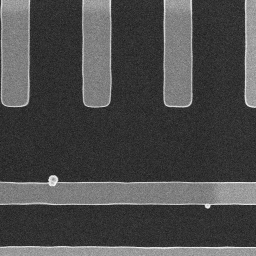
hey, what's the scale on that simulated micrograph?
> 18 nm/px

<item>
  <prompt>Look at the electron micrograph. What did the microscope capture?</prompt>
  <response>groups of lines, slits or small figures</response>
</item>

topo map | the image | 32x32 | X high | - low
XXXX------XXXX-------XXX-------X
XXXX------XXXX-------XXX-------X
XXXX------XXXX-------XXX-------X
XXXX------XXXX-------XXX-------X
XXXX------XXXX-------XXX-------X
XXXX------XXXX-------XXX-------X
XXXX------XXXX-------XXX-------X
XXXX------XXXX-------XXX-------X
XXXX------XXXX-------XXX-------X
XXXX------XXXX-------XXX-------X
XXXX------XXXX-------XXX-------X
XXXX------XXXX-------XXX-------X
XXXX------XXXX-------XXX-------X
--------------------------------
--------------------------------
--------------------------------
--------------------------------
--------------------------------
--------------------------------
--------------------------------
--------------------------------
--------------------------------
------X-------------------------
XXXXXXXXXXXXXXXXXXXXXXXXXXXXXXXX
XXXXXXXXXXXXXXXXXXXXXXXXXXXXXXXX
X-----XXXXXXXX------XXX--XXX--XX
--------------------------------
--------------------------------
--------------------------------
--------------------------------
--------------------------------
XXXXXXXXXXXXXXXXXXXXXXXXXXXXXXXX